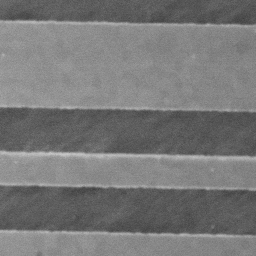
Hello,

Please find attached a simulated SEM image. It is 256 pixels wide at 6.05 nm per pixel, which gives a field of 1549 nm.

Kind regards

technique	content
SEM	lines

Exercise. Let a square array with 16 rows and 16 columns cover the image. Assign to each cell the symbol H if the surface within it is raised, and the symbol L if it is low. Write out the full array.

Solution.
LLLLLLLLLLLLLLLL
HHHHHHHHLLLLLLLL
HHHHHHHHHHHHHHHH
HHHHHHHHHHHHHHHH
HHHHHHHHHHHHHHHH
HHHHHHHHHHHHHHHH
HHHHHHHHHHHHHHHH
LLLLLLLLLLLLLLLL
LLLLLLLLLLLLLLLL
LLLLLLLLLLLLLLLL
HHHHHHHHHHHHHHHH
HHHHHHHHHHHHHHHH
LLLLLLLLLLLLLLLL
LLLLLLLLLLLLLLLL
HHHHLLLLLLLLLLLL
HHHHHHHHHHHHHHHH